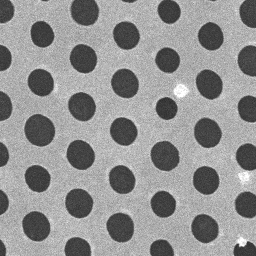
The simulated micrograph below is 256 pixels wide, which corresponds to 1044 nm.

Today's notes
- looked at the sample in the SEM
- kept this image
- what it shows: a regular array of holes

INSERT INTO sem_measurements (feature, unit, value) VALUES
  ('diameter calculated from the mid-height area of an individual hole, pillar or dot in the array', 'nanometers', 116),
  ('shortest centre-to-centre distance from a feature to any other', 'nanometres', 194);